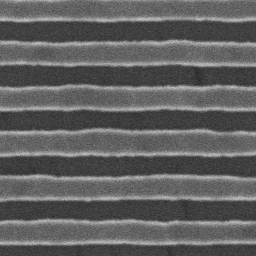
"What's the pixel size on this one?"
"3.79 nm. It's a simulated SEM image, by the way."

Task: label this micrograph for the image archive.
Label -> lines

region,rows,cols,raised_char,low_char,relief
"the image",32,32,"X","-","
XXXXXXXXXXXXXXXXXXXXXXXXXXXXXXXX
XXXXXXXXXXXXXXXXXXXXXXXXXXXXXXXX
XXXXXXXXXXXXXXXXXXXXX---XXXXXXXX
--------------------------------
--------------------------------
XXXXXXXXXXXXXXXXXXXXXXXXXXXXXXXX
XXXXXXXXXXXXXXXXXXXXXXXXXXXXXXXX
XXXXXXXXXXXXXXXXXXXXXXXXXXXXXXXX
--------------------------------
--------------------------------
--------------------------------
XXXXXXXXXXXXXXXXXXXXXXXXXXXXXXXX
XXXXXXXXXXXXXXXXXXXXXXXXXXXXXXXX
XXXXXXXXXXXXXXXXXXXXXXXXXXXXXXXX
--------------------------------
--------------------------------
XXXXXXXXXXXXXXXXXXXXXXXXXXX--XX-
XXXXXXXXXXXXXXXXXXXXXXXXXXXXXXXX
XXXXXXXXXXXXXXXXXXXXXXXXXXXXXXXX
XX------XX---XX---X------XXXXX--
--------------------------------
--------------------------------
XXXXXXXXXXXXXXXXXXXXXXXXXXXXXXXX
XXXXXXXXXXXXXXXXXXXXXXXXXXXXXXXX
XXXXXXXXXXXXXXXXXXXXXXXXXXXXXXXX
--------------------------------
--------------------------------
--------------------------------
XXXXXXXXXXXXXXXXXXXXXXXXXXXXXXXX
XXXXXXXXXXXXXXXXXXXXXXXXXXXXXXXX
XXXXXXXXXX-------XXXXX--XXX-----
--------------------------------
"